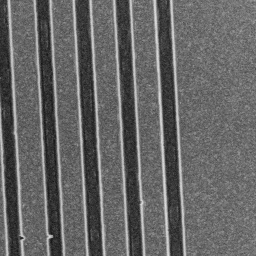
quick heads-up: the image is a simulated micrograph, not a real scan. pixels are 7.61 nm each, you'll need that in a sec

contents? parallel lines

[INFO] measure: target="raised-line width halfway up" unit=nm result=189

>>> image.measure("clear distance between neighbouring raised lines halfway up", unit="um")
0.121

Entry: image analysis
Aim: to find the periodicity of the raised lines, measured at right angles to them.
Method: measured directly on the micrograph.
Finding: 306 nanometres